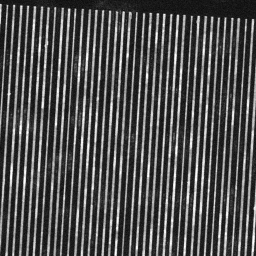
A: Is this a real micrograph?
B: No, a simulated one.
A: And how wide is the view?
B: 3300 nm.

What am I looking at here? parallel lines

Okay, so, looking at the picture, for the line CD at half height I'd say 0.0241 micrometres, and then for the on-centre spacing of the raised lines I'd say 0.088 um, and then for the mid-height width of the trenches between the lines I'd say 65.9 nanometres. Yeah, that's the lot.